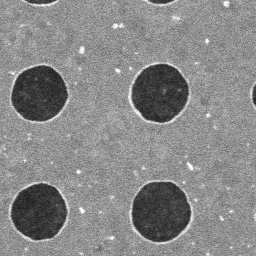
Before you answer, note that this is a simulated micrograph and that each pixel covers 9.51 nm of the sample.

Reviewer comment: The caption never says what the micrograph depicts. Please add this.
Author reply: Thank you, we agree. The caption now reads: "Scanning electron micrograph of holes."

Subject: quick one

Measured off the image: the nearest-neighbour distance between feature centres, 1120 nanometers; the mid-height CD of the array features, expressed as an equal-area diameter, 550 nm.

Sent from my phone